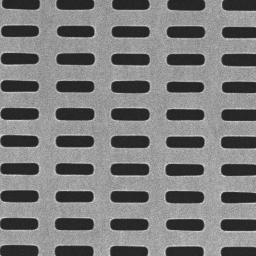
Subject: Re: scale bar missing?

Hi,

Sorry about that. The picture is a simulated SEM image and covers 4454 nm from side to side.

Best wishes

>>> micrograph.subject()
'groups of lines, slits or small figures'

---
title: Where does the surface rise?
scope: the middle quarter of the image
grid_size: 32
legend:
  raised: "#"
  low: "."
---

################################
################################
################################
################################
.......#####.........#####......
........####..........####......
........####.........#####......
###############....#############
################################
################################
################################
........####.........#####......
........####..........####......
........####.........#####......
################################
################################
################################
################################
.......#####.........#####......
........####.........####.......
.......#####.........#####......
################################
################################
################################
################################
.......#####.........#####......
........###..........####.......
.......#####.........#####......
################################
################################
################################
################################